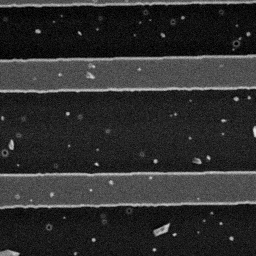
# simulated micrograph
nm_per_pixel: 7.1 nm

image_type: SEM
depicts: lines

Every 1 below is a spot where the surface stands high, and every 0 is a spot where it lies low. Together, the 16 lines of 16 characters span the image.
0000000000000000
0000000000000000
0000000000000000
0000000000000011
1111111111111111
1111111111111111
0000000000000000
0000000000000000
0000000000000000
0000000000000000
0000000000000000
1111111111111111
1111111111111111
0000000000000000
0000000000000000
0000000000000000